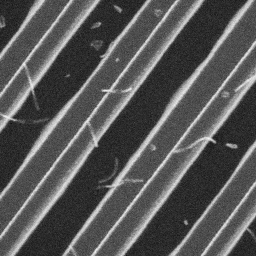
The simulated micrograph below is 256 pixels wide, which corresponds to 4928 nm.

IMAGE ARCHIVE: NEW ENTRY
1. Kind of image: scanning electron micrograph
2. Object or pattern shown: lines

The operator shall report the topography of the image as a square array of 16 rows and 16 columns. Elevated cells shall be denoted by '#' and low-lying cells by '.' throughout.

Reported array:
..####...###...#
..###...####...#
.###...####...##
###....###...###
###...###...####
##...####...###.
#...####...####.
....###...####..
...###...####...
..####...###....
.####...####...#
.###...####...##
###....###...###
###...###....###
##...####...###.
#...####...###..